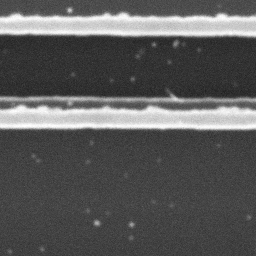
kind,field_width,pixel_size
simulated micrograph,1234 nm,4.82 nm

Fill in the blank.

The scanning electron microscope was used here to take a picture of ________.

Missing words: lines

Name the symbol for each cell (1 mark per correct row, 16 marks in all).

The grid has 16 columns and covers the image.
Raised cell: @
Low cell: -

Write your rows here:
@@@@@@@@@@@@@@@@
@@@@@@@@@@@@@@@@
----------------
----------------
----------------
----------------
@@@@@@@@@@@@@@@@
@@@@@@@@@@@@@@@@
----------------
----------------
----------------
----------------
----------------
----------------
----------------
----------------